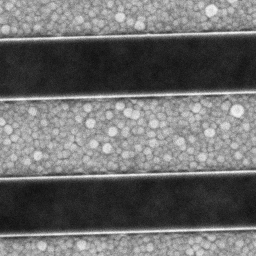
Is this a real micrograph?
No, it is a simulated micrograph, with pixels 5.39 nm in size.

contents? one or a few lines or trenches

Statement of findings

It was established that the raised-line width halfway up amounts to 320 nanometers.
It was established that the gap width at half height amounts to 0.422 µm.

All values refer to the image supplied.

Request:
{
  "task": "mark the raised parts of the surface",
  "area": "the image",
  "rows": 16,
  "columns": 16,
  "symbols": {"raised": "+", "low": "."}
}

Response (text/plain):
................
................
++++++++++++++++
++++++++++++++++
++++++++++++++++
++++++++++++++++
................
................
................
................
................
++++++++++++++++
++++++++++++++++
++++++++++++++++
++++++++........
................